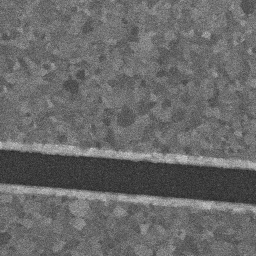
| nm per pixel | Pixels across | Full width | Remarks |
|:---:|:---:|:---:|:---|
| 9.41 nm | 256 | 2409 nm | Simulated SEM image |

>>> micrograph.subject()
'one or a few lines or trenches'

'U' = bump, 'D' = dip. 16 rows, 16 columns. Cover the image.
UUUUUUUUUUUUUUUU
UUUUUUUUUUUUUUUU
UUUUUUUUUUUUUUUU
UUUUUUUUUUUUUUUU
UUUUUUUUUUUUUUUU
UUUUUUUUUUUUUUUU
UUUUUUUUUUUUUUUU
UUUUUUUUUUUUUUUU
UUUUUUUUUUUUUUUU
DDDDDUUUUUUUUUUU
DDDDDDDDDDDDDDDD
DDDDDDDDDDDDDDDD
UUUUUUUUUDDDDDDD
UUUUUUUUUUUUUUUU
UUUUUUUUUUUUUUUU
UUUUUUUUUUUUUUUU